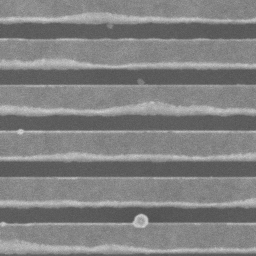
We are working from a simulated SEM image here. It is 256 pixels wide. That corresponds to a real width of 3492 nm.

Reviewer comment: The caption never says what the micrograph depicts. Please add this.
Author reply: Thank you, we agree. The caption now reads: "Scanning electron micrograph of lines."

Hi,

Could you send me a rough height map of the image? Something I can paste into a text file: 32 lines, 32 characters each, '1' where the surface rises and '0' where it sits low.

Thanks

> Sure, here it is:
11111111111111111111111111111111
11111111111111111111111111111111
11111111111111111111111111111111
00000000000000000000000000000000
00000000000000000000000000000000
11111111111111111111111111111111
11111111111111111111111111111111
11111111111111111111111111111111
00000000000000000000000000000000
00000000000000000000000000000000
00000000000000000000000000000000
11111111111111111111111111111111
11111111111111111111111111111111
11111111111111111111111111111111
00000000000000000000000000000000
00000000000000000000000000000000
11111111111111111111111111111111
11111111111111111111111111111111
11111111111111111111111111111111
11111111111111111111111111111111
00000000000000000000000000000000
00000000000000000000000000000000
11111111111111111111111111111111
11111111111111111111111111111111
11111111111111111111111111111111
11111111111111111111111111111111
00000000000000000000000000000000
00000000000000000110000000000000
11111111111111111111111111111111
11111111111111111111111111111111
11111111111111111111111111111111
00000000001100000111111111111111